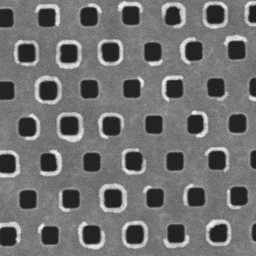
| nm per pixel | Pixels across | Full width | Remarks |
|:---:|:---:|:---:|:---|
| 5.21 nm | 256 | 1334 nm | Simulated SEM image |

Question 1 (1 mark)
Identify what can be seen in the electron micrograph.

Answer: a regular array of holes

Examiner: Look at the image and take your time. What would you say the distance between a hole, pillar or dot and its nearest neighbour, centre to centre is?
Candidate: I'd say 216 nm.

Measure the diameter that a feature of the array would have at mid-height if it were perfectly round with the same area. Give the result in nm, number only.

104